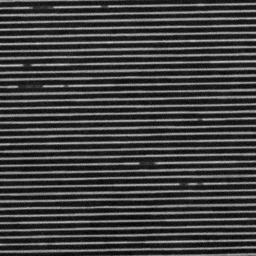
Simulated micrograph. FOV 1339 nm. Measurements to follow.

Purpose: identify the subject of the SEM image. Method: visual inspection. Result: parallel lines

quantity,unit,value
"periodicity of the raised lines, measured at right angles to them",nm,37.4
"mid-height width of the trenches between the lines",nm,30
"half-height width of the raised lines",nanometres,9.1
